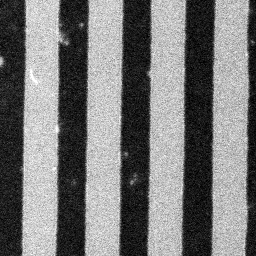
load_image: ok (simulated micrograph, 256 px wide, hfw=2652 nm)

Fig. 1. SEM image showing one or a few lines or trenches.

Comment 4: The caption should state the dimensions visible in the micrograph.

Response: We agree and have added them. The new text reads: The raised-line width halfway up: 29 pixels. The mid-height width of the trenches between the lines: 322 nanometres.